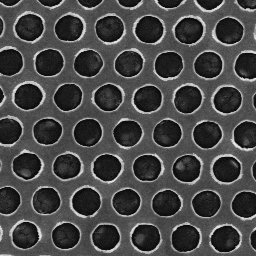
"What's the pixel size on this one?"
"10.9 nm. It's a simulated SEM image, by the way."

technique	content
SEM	a regular array of holes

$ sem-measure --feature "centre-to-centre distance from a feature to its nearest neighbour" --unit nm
432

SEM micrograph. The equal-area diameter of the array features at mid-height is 306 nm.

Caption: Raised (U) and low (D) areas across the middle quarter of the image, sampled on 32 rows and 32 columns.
UUDDDDDDDDUUDDDDDDDDUUDDDDDDDDUU
UUUDDDDDDUUUUDDDDDDUUUUDDDDDDDUU
UUUUDDDDUUUUUUDDDDDUUUUDDDDDDUUU
UUUUUUUUUUUUUUUUUUUUUUUUUDUUUUUU
UUUUUUUUUUUUUUUUUUUUUUUUUUUUUUUU
DDDUUUUUUUDDDUUUUUUUDDDUUUUUUUDD
DDDDUUUUDDDDDDUUUUUDDDDDUUUUDDDD
DDDDDUUUDDDDDDDUUUDDDDDDUUUUDDDD
DDDDDUUDDDDDDDDUUDDDDDDDDUUUDDDD
DDDDUUUUDDDDDDUUUDDDDDDDUUUDDDDD
DDDDUUUUDDDDDDUUUUDDDDDDUUUUDDDD
DDUUUUUUUDDDDUUUUUUDDDDUUUUUDDDD
UUUUUUUUUUUUUUUUUUUUUUUUUUUUUUDU
UUUUUUUUUUUUUUUUUUUUUUUUUUUUUUUU
UUUUDDDDUUUUUUDDDDUUUUUUDDDDUUUU
UUUDDDDDDUUUUDDDDDDUUUUDDDDDDUUU
UUDDDDDDDDUUDDDDDDDDUUDDDDDDDUUU
UUDDDDDDDDUUDDDDDDDDUUDDDDDDDDUU
UUUDDDDDDUUUUDDDDDDUUUDDDDDDDUUU
UUUDDDDDDUUUUDDDDDDUUUUDDDDDDUUU
UUUUUDDUUUUUUUUDDUUUUUUUDDDUUUUU
UUUUUUUUUUUUUUUUUUUUUUUUUUUUUUUU
DDUUUUUUUUDUUUUUUUUUUDUUUUUUUUUU
DDDUUUUUDDDDDUUUUUDDDDDUUUUUUDDD
DDDDUUUUDDDDDDUUUUDDDDDDUUUUDDDD
DDDDDUUDDDDDDDDUUDDDDDDDUUUDUDDD
DDDDUUUDDDDDDDUUUDDDDDDDUUUDDDDD
DDDDUUUUDDDDDDUUUUDDDDDDUUUDDDDD
DDDUUUUUDDDDDUUUUUDDDDDUUUUUDDDD
UUUUUUUUUUDUUUUUUUUUUUUUUUUUUDDD
UUUUUUUUUUUUUUUUUUUUUUUUUUUUUUUU
UUUUDDDUUUUUUUDDDUUUUUUUUDDUUUUU